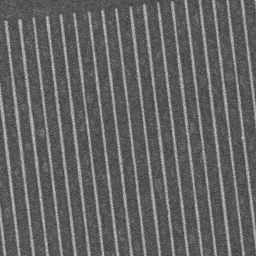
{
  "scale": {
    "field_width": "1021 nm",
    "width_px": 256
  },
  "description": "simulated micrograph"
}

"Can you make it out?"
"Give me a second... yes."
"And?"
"parallel lines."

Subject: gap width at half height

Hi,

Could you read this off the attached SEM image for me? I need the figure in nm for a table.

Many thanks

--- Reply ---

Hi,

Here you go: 45.1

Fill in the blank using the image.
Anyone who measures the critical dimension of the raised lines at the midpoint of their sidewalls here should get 10.4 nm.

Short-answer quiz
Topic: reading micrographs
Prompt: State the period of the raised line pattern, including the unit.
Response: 0.0556 um